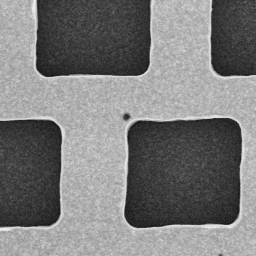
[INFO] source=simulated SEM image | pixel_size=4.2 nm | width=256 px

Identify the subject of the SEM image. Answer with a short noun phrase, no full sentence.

holes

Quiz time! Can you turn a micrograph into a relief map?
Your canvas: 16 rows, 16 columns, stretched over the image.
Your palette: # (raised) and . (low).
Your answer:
##.......####...
##.......####...
##.......####...
##.......####...
###......####...
################
################
#..#########..##
....####.......#
....####.......#
....####.......#
....####.......#
....####.......#
....####.......#
################
################